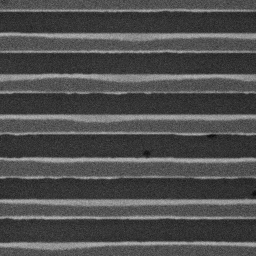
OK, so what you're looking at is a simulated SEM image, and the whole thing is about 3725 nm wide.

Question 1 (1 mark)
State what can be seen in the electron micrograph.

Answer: lines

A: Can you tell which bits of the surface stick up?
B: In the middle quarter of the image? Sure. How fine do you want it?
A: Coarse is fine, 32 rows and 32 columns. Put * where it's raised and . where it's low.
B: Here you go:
................................
................................
................................
***************...**************
********************************
********************************
********************************
................................
................................
................................
................................
................................
................................
******......********************
********************************
********************************
********************************
.............................***
................................
................................
................................
................................
................................
................................
********************************
********************************
********************************
********************************
................................
................................
................................
................................